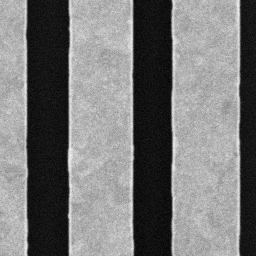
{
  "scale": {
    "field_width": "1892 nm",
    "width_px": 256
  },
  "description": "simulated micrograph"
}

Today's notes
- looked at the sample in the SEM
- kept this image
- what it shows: lines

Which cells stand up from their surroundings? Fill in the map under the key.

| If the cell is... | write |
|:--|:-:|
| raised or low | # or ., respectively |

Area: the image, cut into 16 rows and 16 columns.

##..####...####.
##..####...####.
##..####...####.
##..####...####.
##..####...####.
##..####...####.
##..####...####.
##..####...####.
##..####...####.
##..####...####.
##..####...####.
##..####...####.
##..####...####.
##..####...####.
##..####...####.
##..####...####.